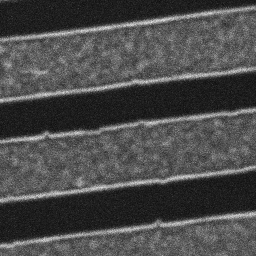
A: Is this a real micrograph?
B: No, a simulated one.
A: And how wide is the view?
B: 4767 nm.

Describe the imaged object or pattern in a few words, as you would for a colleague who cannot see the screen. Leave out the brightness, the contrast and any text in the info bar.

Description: one or a few lines or trenches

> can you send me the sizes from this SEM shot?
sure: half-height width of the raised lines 0.82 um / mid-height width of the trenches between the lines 1.07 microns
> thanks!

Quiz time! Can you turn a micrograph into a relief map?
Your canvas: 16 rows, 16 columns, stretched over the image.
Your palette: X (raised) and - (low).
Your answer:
XXXXXXXXXXXXXXXX
XXXXXXXXX-------
----------------
----------------
--------------XX
------XXXXXXXXXX
XXXXXXXXXXXXXXXX
XXXXXXXXXXX-----
XXX-------------
----------------
----------------
--------XXXXXXXX
XXXXXXXXXXXXXXXX
XXXXXXXXXXXXXXX-
XXXXXXX---------
----------------